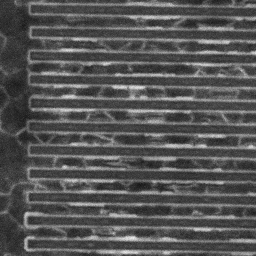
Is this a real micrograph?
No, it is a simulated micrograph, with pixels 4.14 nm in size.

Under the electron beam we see parallel lines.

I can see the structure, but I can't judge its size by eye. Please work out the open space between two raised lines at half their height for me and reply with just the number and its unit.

40.8 nm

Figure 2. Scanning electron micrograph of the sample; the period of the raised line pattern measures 97.3 nm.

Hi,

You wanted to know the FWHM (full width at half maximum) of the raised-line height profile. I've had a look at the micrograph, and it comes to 56.9 nm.